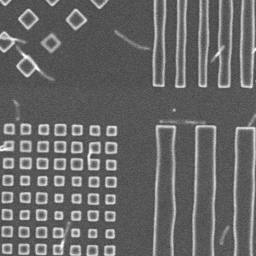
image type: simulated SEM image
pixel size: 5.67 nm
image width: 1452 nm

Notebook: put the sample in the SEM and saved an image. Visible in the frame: groups of lines, slits or small figures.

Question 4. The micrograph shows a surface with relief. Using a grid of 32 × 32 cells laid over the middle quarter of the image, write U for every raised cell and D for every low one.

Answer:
DDDDDDDDDDDDDDDDDDDDDDUUUDDDUUDD
DDDDDDDDDDDDDDDDDDDDDDUUUDDDUUDD
DDDDDDDDDDDDDDDDDDDDDDUUUDDDUUDD
DDDDDDDDDDDDDDDDDDDDDDUUUDDDUUDD
DDDDDDDDDDDDDDDDDDDDDDUUUDDDUUDD
DDDDDDDDDDDDDDDDDDDDDDDUUDDDUUDD
DDDDDDDDDDDDDDDDDDDDDDDDDDDDDDDD
DDDDDDDDDDDDDDDDDDDDDDDDDDDDDDDD
DDDDDDDDDDDDDDDDDDDDDDDDDDDDDDDD
DDDDDDDDDDDDDDDDDDDDDDDDDDDDDDDD
DDDDDDDDDDDDDDDDDDDDDDDDDDDDDDDD
DDDDDDDDDDDDDDDDDDDDDDDDDDDDDDDD
DDDDDDDDDDDDDDDDDDDDDDDDDDDDDDDD
DDDDDDDDDDDDDDDDDDDDDDDDDDDDDDDD
DDDDDDDDDDDDDDDDDDDDDDDDDDDDDDDD
DDUUDDDDDDDDDDDDDDDDDDDDDDDDDDDD
DDUUDDDUUDDUUDDDDDDDDDDUUUUUDDDD
DDUUDDDUUDDUUDDDDDDDDDDUUUUUDDDD
DDDDDDDDDDDDDDDDDDDDDDDUUUUDDDDD
DDDDDDDDDDDDDDDDDDDDDDDUUUUDDDDD
DDUUDDDUUDDUUDDDDDDDDDDUUUUDDDDD
DDUUDDDUUDDUUDDDDDDDDDDDUUUDDDDD
DDDDDDDDDDDDDDDDDDDDDDDDUUUDDDDD
DDDDDDUDDDDDDDDDDDDDDDDDUUUDDDDD
DDUUUDUUUDDUUDDDDDDDDDDUUUUDDDDD
DDUUUDUUUDDUUDDDDDDDDDDUUUUDDDDD
DDDDDDDDDDDDDDDDDDDDDDDUUUUDDDDD
DDDDDDDDDDDDDDDDDDDDDDDUUUUDDDDD
DDUUDDDUUDDUUDDDDDDDDDDUUUUDDDDD
DDUUDDUUUDDUUDDDDDDDDDDUUUUDDDDD
DDDDDDDUDDDUUDDDDDDDDDDUUUUDDDDD
DDDDDDDDDDDDDDDDDDDDDDDUUUUDDDDD